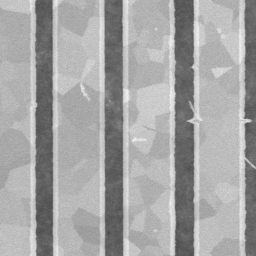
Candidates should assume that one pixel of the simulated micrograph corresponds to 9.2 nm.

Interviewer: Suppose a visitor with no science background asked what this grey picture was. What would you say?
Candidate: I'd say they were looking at one or a few lines or trenches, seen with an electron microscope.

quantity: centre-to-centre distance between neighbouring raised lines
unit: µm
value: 0.646